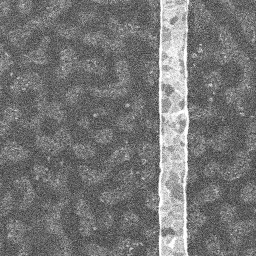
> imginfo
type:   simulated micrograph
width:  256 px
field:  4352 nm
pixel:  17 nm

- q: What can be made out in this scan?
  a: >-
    one or a few lines or trenches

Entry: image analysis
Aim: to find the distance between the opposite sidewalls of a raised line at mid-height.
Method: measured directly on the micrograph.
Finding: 427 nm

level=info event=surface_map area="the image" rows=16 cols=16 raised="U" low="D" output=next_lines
DDDDDDDDDDUUDDDD
DDDDDDDDDDUUDDDD
DDDDDDDDDDUUDDDD
DDDDDDDDDDUUDDDD
DDDDDDDDDDUUDDDD
DDDDDDDDDDUUDDDD
DDDDDDDDDDUUDDDD
DDDDDDDDDDUUDDDD
DDDDDDDDDDUUDDDD
DDDDDDDDDDUUDDDD
DDDDDDDDDDUUDDDD
DDDDDDDDDDUUDDDD
DDDDDDDDDDUUDDDD
DDDDDDDDDDUUDDDD
DDDDDDDDDDUUDDDD
DDDDDDDDDDUUDDDD